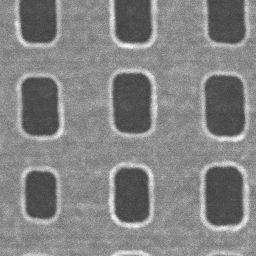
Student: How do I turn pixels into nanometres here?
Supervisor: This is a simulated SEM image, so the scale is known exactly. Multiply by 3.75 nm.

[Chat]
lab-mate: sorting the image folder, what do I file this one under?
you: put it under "holes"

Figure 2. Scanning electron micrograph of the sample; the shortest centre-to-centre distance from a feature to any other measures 339 nm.